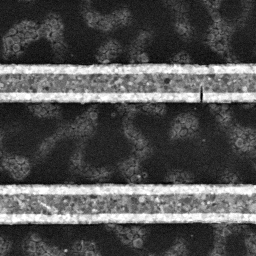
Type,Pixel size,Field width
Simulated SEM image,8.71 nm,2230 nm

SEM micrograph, one or a few lines or trenches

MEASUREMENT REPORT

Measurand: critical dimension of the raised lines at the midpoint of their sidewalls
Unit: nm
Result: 235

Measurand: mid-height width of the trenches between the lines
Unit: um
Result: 0.817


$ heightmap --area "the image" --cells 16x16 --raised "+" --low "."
................
................
................
................
++++++++++++++++
++++++++++++++++
................
................
................
................
................
................
++++++++++++++++
++++++++++++++++
................
................